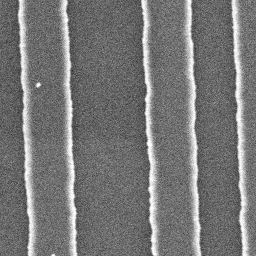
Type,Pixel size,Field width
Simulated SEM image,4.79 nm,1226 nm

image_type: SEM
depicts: lines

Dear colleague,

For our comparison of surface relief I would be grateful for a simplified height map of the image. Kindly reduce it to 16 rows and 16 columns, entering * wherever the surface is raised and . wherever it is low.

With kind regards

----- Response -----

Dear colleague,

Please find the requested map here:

.***.....***...*
.***.....***...*
.***.....***...*
.***.....***...*
.***.....***...*
.***.....***...*
..**.....***...*
..**.....***...*
..**.....***...*
..**.....***...*
..***....***...*
..***....***...*
..***....***...*
..***....***...*
..***.....**...*
..***.....**...*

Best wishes